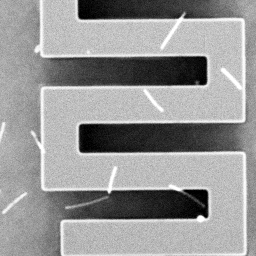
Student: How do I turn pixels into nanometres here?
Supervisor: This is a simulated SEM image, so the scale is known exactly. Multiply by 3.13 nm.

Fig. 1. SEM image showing groups of lines, slits or small figures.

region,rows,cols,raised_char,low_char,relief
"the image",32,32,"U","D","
DDDDDUUUUUDDDDDDDDDDDDDDDDDDDDDD
DDDDDUUUUUDDDDDDDDDDDDDDDDDDDDDD
DDDDDUUUUUDDDDDDDDDDDDUDUUUUUUDD
DDDDDUUUUUUUUUUUUUUUUUUUUUUUUUUD
DDDDDUUUUUUUUUUUUUUUUUUUUUUUUUUD
DDDDDUUUUUUUUUUUUUUUUUUUUUUUUUUD
DDDDDUUUUUUUUUUUUUUUUUUUUUUUUUUD
DDDDDDDDDDDDDDDDDDDDDDDDDDUUUUUD
DDDDDDDDDDDDDDDDDDDDDDDDDDUUUUUD
DDDDDDDDDDDDDDDDDDDDDDDDDDUUUUUD
DDDDDDDDDDDDDDDDDDDDDDDDDDUUUUUD
DDDDDUUUUUUUUUUUUUUUUUUUUUUUUUUD
DDDDDUUUUUUUUUUUUUUUUUUUUUUUUUUD
DDDDDUUUUUUUUUUUUUUUUUUUUUUUUUUD
DDDDDUUUUUUUUUUUUUUUUUUUUUUUUUUD
DDDDDUUUUUDDDDDDDDDDDDDDDDDDDDDD
DDDDDUUUUUDDDDDDDDDDDDDDDDDDDDDD
DDDDDUUUUUDDDDDDDDDDDDDDDDDDDDDD
DDDDDUUUUUDDDDDDDDDDDDDDDDDDDDDD
DDDDDUUUUUUUUUUUUUUUUUUUUUUUUUUD
DDDDDUUUUUUUUUUUUUUUUUUUUUUUUUUD
DDDDDUUUUUUUUUUUUUUUUUUUUUUUUUUD
DDDDDUUUUUUUUUUUUUUUUUUUUUUUUUUD
DDDDDDUUUUUUUUUUUUUUUUUUUUUUUUUD
DDDDDDDDDDDDDDDDDDDDDDDDDDUUUUUD
DDDDDDDDDDDDDDDDDDDDDDDDDDUUUUUD
DDDDDDDDDDDDDDDDDDDDDDDDDDUUUUUD
DDDDDDDDDDDDDDDDDDDDDDUUUUUUUUUD
DDDDDDDDUUUUUUUUUUUUUUUUUUUUUUUD
DDDDDDDDUUUUUUUUUUUUUUUUUUUUUUUD
DDDDDDDDUUUUUUUUUUUUUUUUUUUUUUUD
DDDDDDDDUUUUUUUUUUUUUUUUUUUUUUUD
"